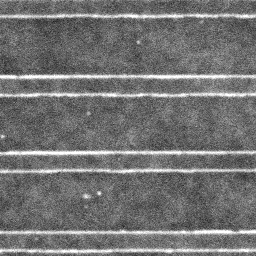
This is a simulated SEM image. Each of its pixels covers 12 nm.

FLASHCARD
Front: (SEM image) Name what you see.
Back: lines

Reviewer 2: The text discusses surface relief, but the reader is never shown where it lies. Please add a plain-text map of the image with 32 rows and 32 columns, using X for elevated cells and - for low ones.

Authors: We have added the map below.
XXXXXXXXXXXXXXXXXXXXXXXXXXXXXXXX
XXXXXXXXXXXXXXXXXXXXXXXXXXXXXXXX
--------------------------------
--------------------------------
--------------------------------
--------------------------------
--------------------------------
--------------------------------
--------------------------------
--------------------------------
XXXXXXXXXXXXXXXXXXXXXXXXXXXXXXXX
XXXXXXXXXXXXXXXXXXXXXXXXXXXXXXXX
--------------------------------
--------------------------------
--------------------------------
--------------------------------
--------------------------------
--------------------------------
--------------------------------
XXXXXXXXXXXXXXXXXXXXXXXXXXXXXXXX
XXXXXXXXXXXXXXXXXXXXXXXXXXXXXXXX
--------------------------------
--------------------------------
--------------------------------
--------------------------------
--------------------------------
--------------------------------
--------------------------------
--------------------------------
XXXXXXXXXXXXXXXXXXXXXXXXXXXXXXXX
XXXXXXXXXXXXXXXXXXXXXXXXXXXXXXXX
--------------------------------